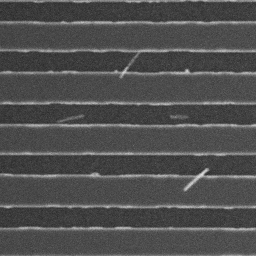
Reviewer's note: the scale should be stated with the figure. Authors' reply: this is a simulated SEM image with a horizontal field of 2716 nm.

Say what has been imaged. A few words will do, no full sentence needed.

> lines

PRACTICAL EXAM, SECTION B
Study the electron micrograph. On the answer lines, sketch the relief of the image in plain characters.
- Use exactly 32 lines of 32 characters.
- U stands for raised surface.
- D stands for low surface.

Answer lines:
DDDDDDDDDDDDDDDDDDDDDDDDDDDDDDDD
DDDDDDDDDDDDDDDDDDDDDDDDDDDDDDDD
DDDDDDDDDDDDDDDDDDDDDDDDDDDDDDDD
UUUUUUUUUUUUUUUUUUUUUUUUUUUUUUUU
UUUUUUUUUUUUUUUUUUUUUUUUUUUUUUUU
UUUUUUUUUUUUUUUUUUUUUUUUUUUUUUUU
DDDDDDDDDDDDDDDDDDDDDDDDDDDDDDDD
DDDDDDDDDDDDDDDDDDDDDDDDDDDDDDDD
DDDDDDDDDDDDDDDDDDDDDDDDDDDDDDDD
UUUUUUUUUUUUUUUUUUUUUUUUUUUUUUUU
UUUUUUUUUUUUUUUUUUUUUUUUUUUUUUUU
UUUUUUUUUUUUUUUUUUUUUUUUUUUUUUUU
UUUUUUUUUUUUUUUUUUUUUUUUUUUUUUUU
DDDDDDDDDDDDDDDDDDDDDDDDDDDDDDDD
DDDDDDDDDDDDDDDDDDDDDDDDDDDDDDDD
DDDDDDDDDDDDDDDDDDDDDDDDDDDDDDDD
UUUUUUUUUUUUUUUUUUUUUUUUUUUUUUUU
UUUUUUUUUUUUUUUUUUUUUUUUUUUUUUUU
UUUUUUUUUUUUUUUUUUUUUUUUUUUUUUUU
DDDDDDDDDDDDDDDDDDDDDDDDDDDDDDDD
DDDDDDDDDDDDDDDDDDDDDDDDDDDDDDDD
DDDDDDDDDDDDDDDDDDDDDDDDDDDDDDDD
UUUUUUUUUUUUUUUUUUUUUUUUUUUUUUUU
UUUUUUUUUUUUUUUUUUUUUUUUUUUUUUUU
UUUUUUUUUUUUUUUUUUUUUUUUUUUUUUUU
UUUUUUUUUUUUUUUUUUUUUUUUUUUUUUUU
DDDDDDDDDDDDDDDDDDDDDDDDDDDDDDDD
DDDDDDDDDDDDDDDDDDDDDDDDDDDDDDDD
DDUUUDDUDUUUUDUUUDDDDUDDDDDDDDDD
UUUUUUUUUUUUUUUUUUUUUUUUUUUUUUUU
UUUUUUUUUUUUUUUUUUUUUUUUUUUUUUUU
UUUUUUUUUUUUUUUUUUUUUUUUUUUUUUUU